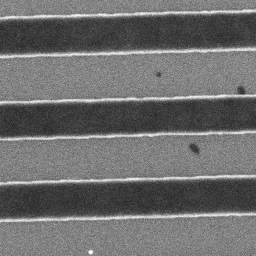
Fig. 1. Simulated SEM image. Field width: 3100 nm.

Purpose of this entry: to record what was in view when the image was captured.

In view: lines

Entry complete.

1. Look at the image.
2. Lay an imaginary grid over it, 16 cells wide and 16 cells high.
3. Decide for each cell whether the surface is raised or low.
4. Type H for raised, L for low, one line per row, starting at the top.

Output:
LLLLLLLLLLLLLLLL
HHHHHHHHHHHHHHHH
HHHHHHHHHHHHHHHH
HHLLLLLLLLLLLLLL
LLLLLLLLLLLLLLLL
LLLLLLLLLLLLLLLL
HHHHHHHHHHHHHHHH
HHHHHHHHHHHHHHHH
HHHHHHHHLLLLLLLL
LLLLLLLLLLLLLLLL
LLLLLLLLLLLLLLLL
HHHHHHHHHHHHHHHH
HHHHHHHHHHHHHHHH
HHHHHHHHHHHHHLLL
LLLLLLLLLLLLLLLL
LLLLLLLLLLLLLLLL